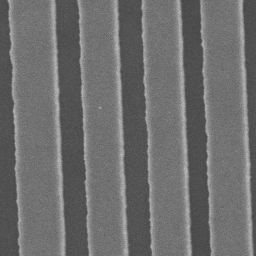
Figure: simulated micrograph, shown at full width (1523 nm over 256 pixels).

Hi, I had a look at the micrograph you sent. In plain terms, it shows lines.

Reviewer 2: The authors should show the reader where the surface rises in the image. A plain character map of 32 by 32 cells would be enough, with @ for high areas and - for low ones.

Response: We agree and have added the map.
-@@@@@@---@@@@@---@@@@@--@@@@@--
-@@@@@@---@@@@@---@@@@@--@@@@@--
-@@@@@@---@@@@@---@@@@@--@@@@@--
-@@@@@@---@@@@@---@@@@@--@@@@@@-
-@@@@@@---@@@@@---@@@@@--@@@@@@-
-@@@@@@---@@@@@---@@@@@--@@@@@@-
-@@@@@@---@@@@@---@@@@@--@@@@@@-
-@@@@@@---@@@@@---@@@@@--@@@@@@-
--@@@@@---@@@@@---@@@@@--@@@@@@-
--@@@@@---@@@@@---@@@@@--@@@@@@-
--@@@@@---@@@@@---@@@@@--@@@@@@-
--@@@@@---@@@@@---@@@@@---@@@@@-
--@@@@@---@@@@@---@@@@@---@@@@@-
--@@@@@---@@@@@---@@@@@---@@@@@-
--@@@@@---@@@@@---@@@@@---@@@@@-
--@@@@@---@@@@@---@@@@@---@@@@@-
--@@@@@---@@@@@---@@@@@---@@@@@-
--@@@@@@---@@@@----@@@@---@@@@@-
--@@@@@@---@@@@----@@@@---@@@@@-
--@@@@@@---@@@@----@@@@---@@@@@-
--@@@@@@---@@@@----@@@@---@@@@@-
--@@@@@@---@@@@@---@@@@---@@@@@-
--@@@@@@---@@@@@---@@@@---@@@@@-
--@@@@@@---@@@@@---@@@@---@@@@@-
--@@@@@@---@@@@@---@@@@@--@@@@@-
--@@@@@@---@@@@@---@@@@@--@@@@@-
--@@@@@@---@@@@@---@@@@@--@@@@@-
--@@@@@@---@@@@@---@@@@@--@@@@@-
--@@@@@@---@@@@@---@@@@@--@@@@@-
--@@@@@@---@@@@@---@@@@@--@@@@@-
--@@@@@@---@@@@@---@@@@@--@@@@@@
--@@@@@@---@@@@@---@@@@@--@@@@@@